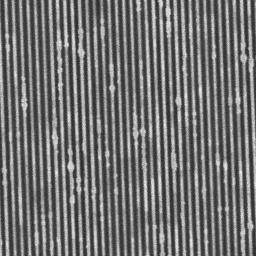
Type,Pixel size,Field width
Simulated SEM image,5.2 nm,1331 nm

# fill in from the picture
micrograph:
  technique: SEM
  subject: parallel lines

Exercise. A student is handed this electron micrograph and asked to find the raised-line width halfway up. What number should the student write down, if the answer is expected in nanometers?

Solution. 18.8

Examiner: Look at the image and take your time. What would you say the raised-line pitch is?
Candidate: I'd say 38.3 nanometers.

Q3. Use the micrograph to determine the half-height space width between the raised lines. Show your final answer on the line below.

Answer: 23.4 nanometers